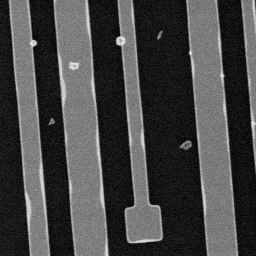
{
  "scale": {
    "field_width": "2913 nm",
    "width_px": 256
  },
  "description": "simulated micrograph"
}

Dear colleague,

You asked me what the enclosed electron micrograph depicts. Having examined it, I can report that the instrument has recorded groups of lines, slits or small figures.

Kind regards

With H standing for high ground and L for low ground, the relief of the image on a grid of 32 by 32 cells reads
LHHHLLLHHHHLLLLHHLLLLLLHHHHLLLHH
LHHHLLLHHHHLLLLHHLLLLLLHHHHLLLHH
LHHHLLLHHHHLLLLHHLLLLLLLHHHLLLHH
LHHHLLLHHHHLLLLHHLLLLLLLHHHLLLHH
LHHHLLLHHHHLLLLHHLLLLLLLHHHLLLLH
LLHHLLLHHHHLLLLHHLLLLLLLHHHLLLLH
LLHHLLLHHHHLLLLHHLLLLLLLHHHHLLLH
LLHHLLLHHHHLLLLHHLLLLLLLHHHHLLLH
LLHHLLLLHHHHLLLHHLLLLLLLHHHHLLLH
LLHHLLLLHHHHLLLLHLLLLLLLHHHHLLLH
LLHHLLLLHHHHLLLLHLLLLLLLHHHHLLLH
LLHHHLLLHHHHLLLLHLLLLLLLHHHHLLLH
LLHHHLLLHHHHLLLLHHLLLLLLHHHHLLLH
LLHHHLLLHHHHLLLLHHLLLLLLHHHHLLLH
LLHHHLLLHHHHLLLLHHLLLLLLLHHHLLLH
LLHHHLLLHHHHLLLLHHLLLLLLLHHHLLLH
LLLHHLLLHHHHLLLLHHLLLLLLLHHHLLLL
LLLHHLLLHHHHLLLLHHLLLLLLLHHHLLLL
LLLHHLLLHHHHLLLLHHLLLLLLLHHHHLLL
LLLHHLLLHHHHLLLLHHLLLLLLLHHHHLLL
LLLHHLLLHHHHHLLLHHLLLLLLLHHHHLLL
LLLHHLLLLHHHHLLLHHLLLLLLLHHHHLLL
LLLHHLLLLHHHHLLLLHLLLLLLLHHHHLLL
LLLHHLLLLHHHHLLLLHLLLLLLLHHHHLLL
LLLHHHLLLHHHHLLLLHHLLLLLLHHHHLLL
LLLHHHLLLHHHHLLLLHHLLLLLLLHHHLLL
LLLLHHLLLHHHHLLLHHHHLLLLLLHHHLLL
LLLLHHLLLHHHHLLLHHHHLLLLLLHHHLLL
LLLLHHLLLHHHHLLLHHHHLLLLLLHHHLLL
LLLLHHLLLHHHHLLLHHHHLLLLLLHHHLLL
LLLLHHLLLHHHHLLLLLLLLLLLLLHHHHLL
LLLLHHLLLHHHHLLLLLLLLLLLLLHHHHLL